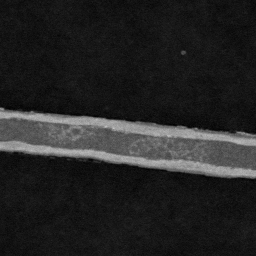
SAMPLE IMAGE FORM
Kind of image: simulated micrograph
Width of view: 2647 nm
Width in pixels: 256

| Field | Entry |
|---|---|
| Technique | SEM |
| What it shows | one or a few lines or trenches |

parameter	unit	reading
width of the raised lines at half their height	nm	330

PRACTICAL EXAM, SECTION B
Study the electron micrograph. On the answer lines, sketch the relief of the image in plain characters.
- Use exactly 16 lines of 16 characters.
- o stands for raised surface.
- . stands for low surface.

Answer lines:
................
................
................
................
................
................
................
ooo.............
ooooooooooooo...
....oooooooooooo
.............ooo
................
................
................
................
................